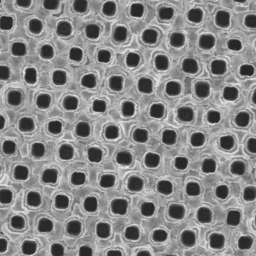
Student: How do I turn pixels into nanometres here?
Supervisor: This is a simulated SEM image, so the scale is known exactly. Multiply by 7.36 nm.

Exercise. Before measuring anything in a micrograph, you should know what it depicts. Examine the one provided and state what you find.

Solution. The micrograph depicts a regular array of holes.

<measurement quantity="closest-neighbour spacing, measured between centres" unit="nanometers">205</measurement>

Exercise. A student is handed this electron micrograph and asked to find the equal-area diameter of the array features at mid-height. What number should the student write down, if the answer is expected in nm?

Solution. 105